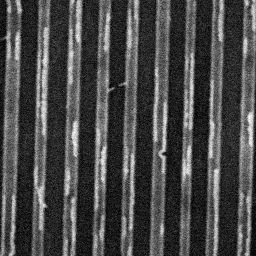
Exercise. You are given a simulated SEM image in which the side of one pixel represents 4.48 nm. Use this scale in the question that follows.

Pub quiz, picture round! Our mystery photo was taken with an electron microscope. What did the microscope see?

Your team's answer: parallel lines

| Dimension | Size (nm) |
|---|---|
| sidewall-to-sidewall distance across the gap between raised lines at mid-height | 80.5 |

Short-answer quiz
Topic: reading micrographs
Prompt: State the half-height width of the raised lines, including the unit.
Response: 50.9 nanometers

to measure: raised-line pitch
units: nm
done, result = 132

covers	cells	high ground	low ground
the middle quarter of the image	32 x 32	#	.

.###.....##.....##.....###....##
.###.....##.....##.....###....##
.###.....##.....##.....###....##
.###.....##....###.....###....##
.###.....##....###.....###....##
.###.....##....###.....###....##
.###.....##....###.....###....##
.###.....##....###.....###....##
.###....###....###.....###....##
.###....###....###.....###....##
.###....###....###.....###....##
.###....###....###.....###....##
.###....###....###.....###....##
.###....###....###.....###....##
.###....###....###.....###....##
.###....###....###.....##.....##
.###....###....###....###.....##
.###....###....###....###.....##
.##.....###....###....###.....##
.##.....###....###....###.....##
.##.....###....###....###.....##
.##.....###....###.....##.....##
.##.....##.....###....##......##
###.....##.....###.....##.....##
###.....##.....###....###.....##
###.....##.....###....###.....##
###.....##.....##.....###.....##
###.....##.....##.....###.....##
###.....##.....##.....###.....##
###.....##.....##.....###....###
###.....##.....##.....###....###
###.....##.....##.....###....###